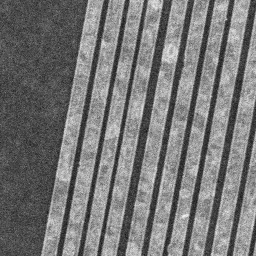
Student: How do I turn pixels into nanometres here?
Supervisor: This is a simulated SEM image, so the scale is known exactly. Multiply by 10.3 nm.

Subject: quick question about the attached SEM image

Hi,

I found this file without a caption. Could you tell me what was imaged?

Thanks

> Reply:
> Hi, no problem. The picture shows parallel lines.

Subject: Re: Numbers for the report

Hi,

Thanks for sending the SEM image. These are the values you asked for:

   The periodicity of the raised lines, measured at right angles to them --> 0.213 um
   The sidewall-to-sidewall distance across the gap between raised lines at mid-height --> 0.0707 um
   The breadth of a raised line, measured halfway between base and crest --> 140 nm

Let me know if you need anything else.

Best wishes